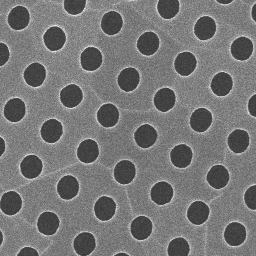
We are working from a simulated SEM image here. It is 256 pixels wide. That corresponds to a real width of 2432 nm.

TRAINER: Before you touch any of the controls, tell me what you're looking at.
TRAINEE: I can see a regular array of holes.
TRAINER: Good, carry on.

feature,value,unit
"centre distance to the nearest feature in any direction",389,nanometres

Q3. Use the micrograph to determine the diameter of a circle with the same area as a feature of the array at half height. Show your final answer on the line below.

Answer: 221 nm